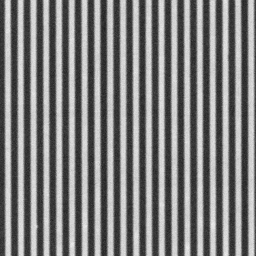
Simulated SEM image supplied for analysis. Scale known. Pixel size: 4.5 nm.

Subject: parallel lines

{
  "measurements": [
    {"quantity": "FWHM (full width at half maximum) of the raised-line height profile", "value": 6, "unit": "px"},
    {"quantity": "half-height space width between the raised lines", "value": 0.0309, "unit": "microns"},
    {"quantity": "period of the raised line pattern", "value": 57.5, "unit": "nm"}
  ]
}